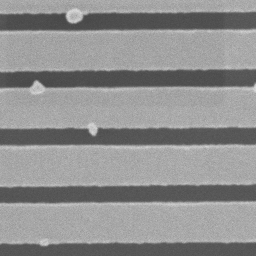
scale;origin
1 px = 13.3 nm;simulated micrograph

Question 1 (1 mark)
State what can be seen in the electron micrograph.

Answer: lines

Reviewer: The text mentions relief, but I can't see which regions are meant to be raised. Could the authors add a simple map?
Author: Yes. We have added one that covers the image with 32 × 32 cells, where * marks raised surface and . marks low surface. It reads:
********************************
************************........
.........*......................
................................
********************************
********************************
********************************
********************************
********************************
................................
....*...........................
********************************
********************************
********************************
********************************
********************************
...........*....................
................................
********************************
********************************
********************************
********************************
********************************
................................
................................
********************************
********************************
********************************
********************************
********************************
.....*..........................
................................